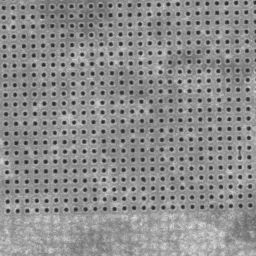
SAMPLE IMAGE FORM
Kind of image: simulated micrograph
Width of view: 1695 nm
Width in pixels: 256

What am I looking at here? a regular array of holes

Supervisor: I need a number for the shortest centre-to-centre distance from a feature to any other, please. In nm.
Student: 62.3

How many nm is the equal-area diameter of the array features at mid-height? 31.7